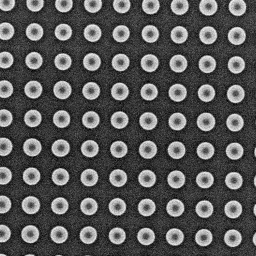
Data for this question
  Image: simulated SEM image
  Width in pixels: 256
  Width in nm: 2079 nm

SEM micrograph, an array of small figures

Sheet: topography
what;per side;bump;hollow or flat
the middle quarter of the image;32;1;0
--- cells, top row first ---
10000111100011110001111000011110
00000001000001100000111000011100
00000000000000000000000000000000
00000000000000000000000000000000
00000000000000000000000000000000
10000111100011110000111000011100
11000111100011110001111000111100
10000111100011110001111000111100
10000011000001100000111000011100
00000000000000000000000000000000
00000000000000000000000000000000
00000000000000000000000000000000
10000111000001100000110000011000
10000111100011110001111000111100
10000111100011110001111000111100
10000111000011100001111000011100
00000000000000000000000000000000
00000000000000000000000000000000
00000000000000000000000000000000
10000111000001000000110000000000
10001111000011100001111000111100
10001111000011110001111000111100
10000111000011100001111000111100
00000000000000000000110000011000
00000000000000000000000000000000
00000000000000000000000000000000
00000010000000000000000000000000
10000111000011100001111000111100
10001111000011110001111000111100
10000111000011100001111000111100
00000000000001000000110000011000
00000000000000000000000000000000